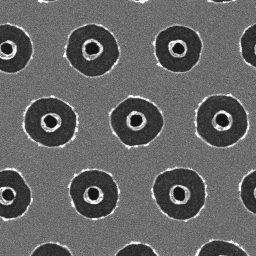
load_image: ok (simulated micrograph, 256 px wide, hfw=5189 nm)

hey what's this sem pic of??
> ring-shaped grooves with a dot in the middle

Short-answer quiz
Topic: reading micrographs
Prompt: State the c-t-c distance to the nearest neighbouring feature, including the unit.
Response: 1690 nm